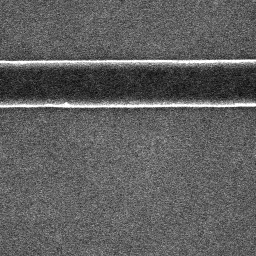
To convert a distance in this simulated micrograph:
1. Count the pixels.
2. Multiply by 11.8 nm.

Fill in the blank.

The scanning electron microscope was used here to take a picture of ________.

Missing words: one or a few lines or trenches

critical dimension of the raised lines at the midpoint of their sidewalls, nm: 534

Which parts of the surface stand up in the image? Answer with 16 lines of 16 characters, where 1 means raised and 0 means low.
0000000000000000
0000000000000000
0000000000000000
0000000000000000
1111111111111111
1111111111111111
1111111111111111
0000000000000000
0000000000000000
0000000000000000
0000000000000000
0000000000000000
0000000000000000
0000000000000000
0000000000000000
0000000000000000